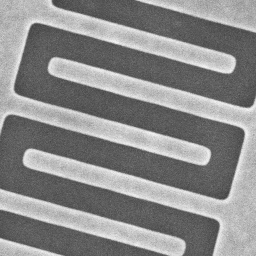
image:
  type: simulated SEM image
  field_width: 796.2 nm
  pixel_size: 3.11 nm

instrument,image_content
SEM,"groups of lines, slits or small figures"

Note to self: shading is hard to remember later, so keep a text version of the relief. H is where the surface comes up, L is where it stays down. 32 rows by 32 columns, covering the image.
HHHHHHLLLLLLLLLLLLLHHHHHHHHHHHHH
HHHHHHHHHLLLLLLLLLLLLLLHHHHHHHHH
HHHHHHHHHHHHLLLLLLLLLLLLLLHHHHHH
HHHHLLLLHHHHHHHHLLLLLLLLLLLLLLHH
HHHLLLLLLLLHHHHHHHHHLLLLLLLLLLLL
HHHLLLLLLLLLLLLHHHHHHHHLLLLLLLLL
HHHLLLLLLLLLLLLLLLHHHHHHHHHLLLLL
HHLLLLLHLLLLLLLLLLLLLLHHHHHHHLLL
HHLLLLHHHHHHLLLLLLLLLLLLLLHHHLLL
HHLLLLLHHHHHHHHLLLLLLLLLLLLLLLLL
HHLLLLLLLLLHHHHHHHHLLLLLLLLLLLLL
HHLLLLLLLLLLLLHHHHHHHHHLLLLLLLLL
HHHHLLLLLLLLLLLLLLHHHHHHHHLLLLLL
HHHHHHHLLLLLLLLLLLLLLHHHHHHHHHLH
HLLHHHHHHHHLLLLLLLLLLLLLLHHHHHHH
LLLLLLHHHHHHHHHLLLLLLLLLLLLLLHHH
LLLLLLLLLLHHHHHHHHHLLLLLLLLLLLLH
LLLLLLLLLLLLLLHHHHHHHHLLLLLLLLLH
LLLLLLLLLLLLLLLLLLHHHHHHHHLLLLHH
LLLHHHHLLLLLLLLLLLLLLHHHHHLLLLHH
LLLHHHHHHHLLLLLLLLLLLLLLLHLLLLHH
LLLLLLHHHHHHHHHLLLLLLLLLLLLLLLHH
LLLLLLLLLHHHHHHHHHLLLLLLLLLLLHHH
LLLLLLLLLLLLLHHHHHHHHLLLLLLLLHHH
HHHLLLLLLLLLLLLLLHHHHHHHHLLLLHHH
HHHHHHLLLLLLLLLLLLLLLHHHHHHHHHHH
LLHHHHHHHHLLLLLLLLLLLLLLHHHHHHHH
LLLLLHHHHHHHHLLLLLLLLLLLLLLHHHHH
LLLLLLLLLHHHHHHHHHLLLLLLLLLHHHHH
LLLLLLLLLLLLLHHHHHHHHLLLLLLHHHHH
HHLLLLLLLLLLLLLLHHHHHHHLLLLHHHHH
HHHHHHLLLLLLLLLLLLLLHHHLLLLHHHHH